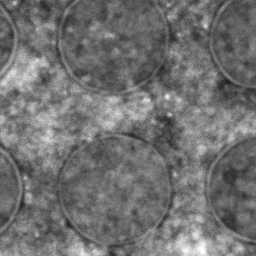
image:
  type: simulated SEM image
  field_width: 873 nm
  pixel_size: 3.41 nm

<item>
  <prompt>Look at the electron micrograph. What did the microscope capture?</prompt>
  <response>raised bodies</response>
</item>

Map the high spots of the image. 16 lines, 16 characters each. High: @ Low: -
----@@@@@@----@@
@---@@@@@@---@@@
@---@@@@@@---@@@
@---@@@@@@---@@@
----@@@@@@----@@
------@@--------
----------------
----------------
----------------
-----@@@@-----@@
@---@@@@@@---@@@
@---@@@@@@@--@@@
@---@@@@@@@--@@@
@---@@-@@@---@@@
-------@@-----@@
----------------